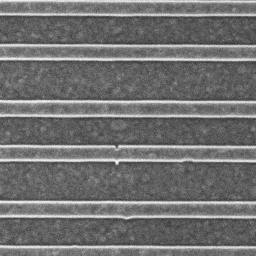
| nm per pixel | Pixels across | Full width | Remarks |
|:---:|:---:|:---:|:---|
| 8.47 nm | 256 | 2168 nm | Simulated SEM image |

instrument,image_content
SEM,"parallel lines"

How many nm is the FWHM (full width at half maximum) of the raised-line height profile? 121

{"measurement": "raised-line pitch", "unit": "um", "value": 0.431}